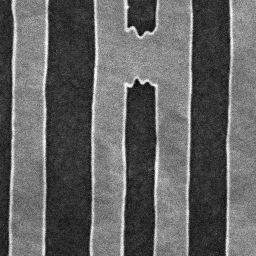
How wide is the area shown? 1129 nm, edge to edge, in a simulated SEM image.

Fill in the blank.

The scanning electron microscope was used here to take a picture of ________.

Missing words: one or a few lines or trenches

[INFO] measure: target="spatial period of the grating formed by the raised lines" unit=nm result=317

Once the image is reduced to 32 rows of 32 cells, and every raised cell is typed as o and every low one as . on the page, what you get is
..oooo......oooo....oooo.....ooo
..oooo......oooo....oooo.....ooo
..oooo......oooo....oooo.....ooo
..oooo......oooo...ooooo.....ooo
..oooo......oooooooooooo.....ooo
..oooo......oooooooooooo.....ooo
..oooo......oooooooooooo.....ooo
..oooo......oooooooooooo.....ooo
..oooo......oooooooooooo.....ooo
..oooo......oooooooooooo.....ooo
..oooo......ooooo..ooooo.....ooo
..ooo.......oooo....oooo.....ooo
..oooo......oooo....oooo.....ooo
..oooo......oooo....oooo.....ooo
..oooo......oooo....oooo.....ooo
..oooo......ooo.....oooo.....ooo
..ooo.......ooo.....oooo....oooo
..oooo......ooo.....oooo....oooo
..oooo......ooo.....oooo....oooo
..oooo......oooo....oooo.....ooo
..oooo......oooo....oooo.....ooo
..oooo......oooo....oooo.....ooo
.ooooo......oooo....oooo....oooo
.ooooo......oooo...oooo.....oooo
.ooooo......oooo...oooo.....oooo
.ooooo......ooo....oooo......ooo
.ooooo......ooo.....ooo.....oooo
.ooooo......ooo.....ooo......ooo
.ooooo.....oooo....oooo......ooo
.ooooo.....oooo....oooo.....oooo
.oooo......oooo....oooo.....oooo
.oooo......oooo....oooo.....oooo